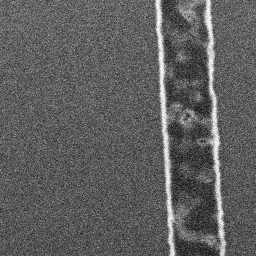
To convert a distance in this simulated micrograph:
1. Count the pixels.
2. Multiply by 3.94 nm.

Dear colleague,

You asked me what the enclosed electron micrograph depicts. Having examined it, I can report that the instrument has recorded one or a few lines or trenches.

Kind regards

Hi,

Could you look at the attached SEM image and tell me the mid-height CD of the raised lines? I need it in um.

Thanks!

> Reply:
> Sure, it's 0.201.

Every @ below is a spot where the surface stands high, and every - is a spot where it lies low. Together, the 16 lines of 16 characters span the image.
----------@@@---
----------@@@---
----------@@@---
----------@@@---
----------@@@---
----------@@@---
----------@@@---
----------@@@---
----------@@@@--
----------@@@@--
----------@@@@--
----------@@@@--
-----------@@@--
-----------@@@--
-----------@@@--
-----------@@@--